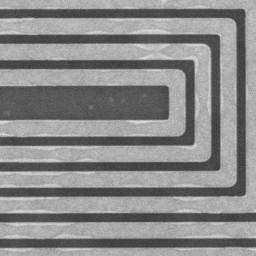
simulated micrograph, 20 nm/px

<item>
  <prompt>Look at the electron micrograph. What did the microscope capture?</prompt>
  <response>groups of lines, slits or small figures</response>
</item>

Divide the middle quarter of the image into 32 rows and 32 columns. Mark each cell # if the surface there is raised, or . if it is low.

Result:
................................
................................
##############################..
##############################..
##############################..
..........................####..
...........................###..
...........................###..
...........................###..
...........................###..
...........................###..
...........................###..
...........................###..
..........................####..
##################.###########..
##############################..
##############################..
##############################..
................................
................................
................................
################################
################################
################################
................................
................................
................................
################################
################################
################################
############################....
................................